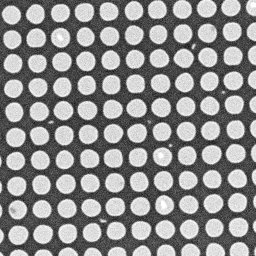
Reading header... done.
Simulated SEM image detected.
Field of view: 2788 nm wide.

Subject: an array of small figures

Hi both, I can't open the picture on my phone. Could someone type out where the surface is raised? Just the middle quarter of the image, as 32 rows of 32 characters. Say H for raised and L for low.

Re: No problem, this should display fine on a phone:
HLLLHHHLLLHHHLLLHHHLLLLHHLLLLHHL
LLLLLHLLLLLLLLLLLLLLLLLLLLLLLLLL
LLLLLLLLLLLLLLLLLLLLLLLLLLLLLLHL
LLLLLHHLLLHHHLLLHHHHLLHHHHLLLHHH
HLLLHHHHLLHHHHLLHHHHLLHHHHLLHHHH
HHLLHHHHLLHHHHLLHHHHLLHHHHLLHHHH
HHLLHHHHLLHHHHLLHHHHLLLHHHLLLHHL
HLLLLHLLLLLLLLLLLLLLLLLLLLLLLLLL
LLLLLLLLLLLLLLLLLLLLLLLLLLLLLLLL
LLLLLHHLLLLHHLLLLHHHLLLHHHLLLHHH
HHLLHHHHLLHHHHLLHHHHLLHHHHHLHHHH
HHLLHHHHLLHHHHLLHHHHLLHHHHLLHHHH
HHLLHHHHLLHHHHLLHHHHLLLHHHLLLHHH
HLLLLHHLLLLLLLLLLLLLLLLLLLLLLLLL
LLLLLLLLLLLLLLLLLLLLLLLLLLLLLLLL
LLLLLHHLLLLHHLLLLHHHLLLHHHLLLHHH
HHLLHHHHLLHHHHLLHHHHLLHHHHHLHHHH
HHLLHHHHLLHHHHHLHHHHLLHHHHHLHHHH
HHLLHHHHLLHHHHLLHHHHLLLHHHLLLHHH
HHLLLHHLLLLLHLLLLLLLLLLLLLLLLLLL
LLLLLLLLLLLLLLLLLLLLLLLLLLLLLLLL
LLLLLLLLLLLLHLLLLHHHLLLHHHLLLHHH
HHLLHHHHLLHHHHLLLHHHHLHHHHHLLHHH
HHLLHHHHHLHHHHLLHHHHHLLHHHHLLHHH
HHLLHHHHHLHHHHLLLHHHLLLHHHLLLHHH
HHLLLHHHLLLHHHLLLLLLLLLLLLLLLLLL
LLLLLLLLLLLLLLLLLLLLLLLLLLLLLLLL
LLLLLLLLLLLLHLLLLLHHLLLHHHLLLHHH
HHLLLHHHLLLHHHHLLHHHHLLHHHHLLHHH
HHHLHHHHHLHHHHHLLHHHHLLHHHHLLHHH
HHHLLHHHHLLHHHHLLHHHHLLHHHHLLHHH
HHLLLHHHLLLHHHLLLLHHLLLLHHLLLLLL